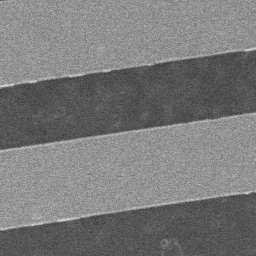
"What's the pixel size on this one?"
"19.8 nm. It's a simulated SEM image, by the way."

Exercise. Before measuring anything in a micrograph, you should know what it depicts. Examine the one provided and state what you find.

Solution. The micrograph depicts one or a few lines or trenches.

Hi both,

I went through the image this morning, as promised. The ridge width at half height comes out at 1530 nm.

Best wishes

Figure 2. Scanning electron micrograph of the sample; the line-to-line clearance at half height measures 1270 nm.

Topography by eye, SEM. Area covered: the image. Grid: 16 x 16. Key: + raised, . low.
++++++++++++++++
++++++++++++++++
++++++++++++++++
+++++++++++++...
++++++..........
................
................
.............+++
......++++++++++
++++++++++++++++
++++++++++++++++
++++++++++++++++
++++++++++++....
++++++..........
................
................